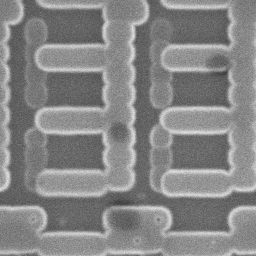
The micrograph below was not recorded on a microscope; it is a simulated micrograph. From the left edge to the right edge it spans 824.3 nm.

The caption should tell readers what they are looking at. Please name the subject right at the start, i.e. wiring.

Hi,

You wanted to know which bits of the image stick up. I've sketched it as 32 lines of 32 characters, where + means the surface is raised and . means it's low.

+++..+++++++++++++...+++++++++++
+++..........+++++...........+++
++...........+++++...........+++
+............++++............+++
+............++++............+++
+............++++............+++
+....++++++++++++...++++++++++++
+...+++++++++++++...++++++++++++
+....++++++++++++....+++++++++++
+............++++............+++
+............++++............+++
+............++++............+++
+............++++............+++
+......++....++++......+++++.+++
+....++++++++++++...++++++++++++
+....++++++++++++...++++++++++++
+....++++++++++++..+++++++++++++
+............++++..++........+++
+............++++............+++
+............++++............+++
+............++++............+++
+....++++++++++++....+++++++++++
+....++++++++++++...++++++++++++
+....+++++++++++....++++++++++++
.........................+++....
................................
+++++........++++++++........+++
++++++.......++++++++........+++
+++++........++++++++........+++
++++++++++++++++++++++++++++++++
++++++++++++++++++++++++++++++++
++++++++++++++++++++++++++++++++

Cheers